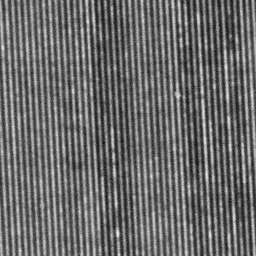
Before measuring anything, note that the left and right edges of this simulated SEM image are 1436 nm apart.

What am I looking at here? parallel lines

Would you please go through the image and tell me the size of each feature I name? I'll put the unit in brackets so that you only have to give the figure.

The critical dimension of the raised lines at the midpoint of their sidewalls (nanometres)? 9.8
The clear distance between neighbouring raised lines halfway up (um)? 0.0252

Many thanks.